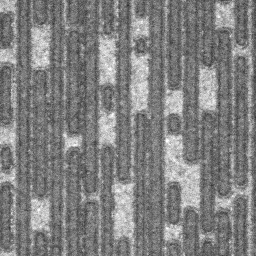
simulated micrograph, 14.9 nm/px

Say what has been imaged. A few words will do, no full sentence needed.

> parallel lines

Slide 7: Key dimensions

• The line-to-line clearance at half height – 91.4 nm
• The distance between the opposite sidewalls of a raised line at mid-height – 0.16 microns